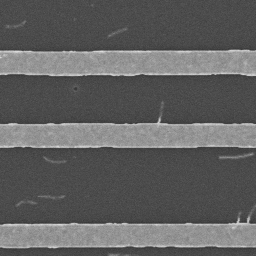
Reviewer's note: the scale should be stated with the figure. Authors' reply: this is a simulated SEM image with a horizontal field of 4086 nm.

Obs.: lines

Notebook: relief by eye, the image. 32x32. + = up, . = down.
................................
................................
................................
................................
................................
................................
+++.....+...++++++++++++++++++++
++++++++++++++++++++++++++++++++
++++++++++++++++++++++++++++++++
................................
................................
................................
................................
................................
................................
.++...++++++++++.++++...++++..++
++++++++++++++++++++++++++++++++
++++++++++++++++++++++++++++++++
................................
................................
................................
................................
................................
................................
................................
................................
................................
................................
++++++++++++++++++++++++++++++++
++++++++++++++++++++++++++++++++
++++++++++++++++++++++++++++++++
................................